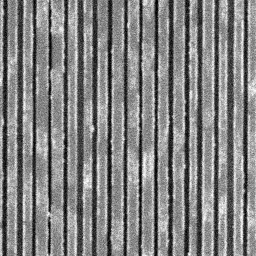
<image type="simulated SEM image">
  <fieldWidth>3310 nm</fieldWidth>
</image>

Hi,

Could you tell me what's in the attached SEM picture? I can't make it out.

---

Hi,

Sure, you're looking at parallel lines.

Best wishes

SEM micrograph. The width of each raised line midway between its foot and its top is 133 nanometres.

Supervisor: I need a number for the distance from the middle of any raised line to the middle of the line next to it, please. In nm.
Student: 195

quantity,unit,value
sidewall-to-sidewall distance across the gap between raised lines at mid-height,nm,66.3